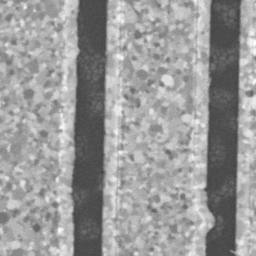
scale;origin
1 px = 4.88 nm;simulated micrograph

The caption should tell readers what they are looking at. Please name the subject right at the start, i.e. one or a few lines or trenches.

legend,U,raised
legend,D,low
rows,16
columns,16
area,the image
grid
UUUUDDDUUUUUUDDU
UUUUDDDUUUUUUDDU
UUUUDDDUUUUUUDDU
UUUUDDDUUUUUUDDU
UUUUDDDUUUUUUDDU
UUUUDDDUUUUUUDDU
UUUUDDDUUUUUUDDU
UUUUDDDUUUUUUDDU
UUUUDDDUUUUUUDDU
UUUUDDDUUUUUUDDU
UUUUDDDUUUUUUDDU
UUUUDDDUUUUUDDDU
UUUUDDDUUUUUDDDU
UUUUDDDUUUUUUDDU
UUUUDDDUUUUUUDDU
UUUUDDDUUUUUDDDU